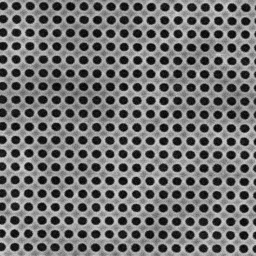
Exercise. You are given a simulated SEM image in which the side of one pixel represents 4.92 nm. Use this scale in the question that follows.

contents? a regular array of holes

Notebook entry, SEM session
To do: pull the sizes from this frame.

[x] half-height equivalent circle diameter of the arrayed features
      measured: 45.5 nanometers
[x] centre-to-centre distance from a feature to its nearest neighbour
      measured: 63.9 nanometres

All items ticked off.